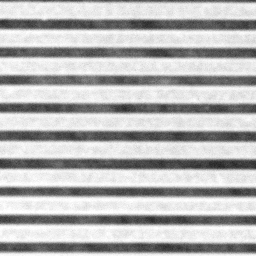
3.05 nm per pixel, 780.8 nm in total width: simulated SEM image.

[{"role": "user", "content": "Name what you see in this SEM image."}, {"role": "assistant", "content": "parallel lines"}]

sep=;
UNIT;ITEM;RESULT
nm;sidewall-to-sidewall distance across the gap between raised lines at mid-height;37.4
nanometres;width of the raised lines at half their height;48.4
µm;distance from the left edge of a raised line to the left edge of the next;0.0851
